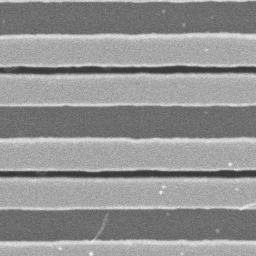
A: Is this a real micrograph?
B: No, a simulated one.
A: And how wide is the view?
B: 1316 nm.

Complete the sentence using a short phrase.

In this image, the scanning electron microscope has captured lines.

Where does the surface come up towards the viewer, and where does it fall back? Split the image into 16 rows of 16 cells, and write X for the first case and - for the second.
----------------
----------------
XXXXXXXXXXXXXXXX
XXXXXXXXXXXXXXXX
XXXXXXXXXXXXXXXX
XXXXXXXXXXXXXXXX
XXXXXXXXXXXXXXXX
----------------
----------------
XXXXXXXXXXXXXXXX
XXXXXXXXXXXXXXXX
XXXXXXXXXXXXXXXX
XXXXXXXXXXXXXXXX
----------------
----------------
XXXXXXXXXXXXXXXX